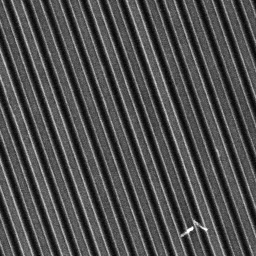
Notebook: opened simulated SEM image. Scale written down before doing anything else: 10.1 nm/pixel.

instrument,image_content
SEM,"parallel lines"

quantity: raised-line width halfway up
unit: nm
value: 98.9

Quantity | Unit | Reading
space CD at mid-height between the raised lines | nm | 78.5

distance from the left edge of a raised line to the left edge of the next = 182 nanometers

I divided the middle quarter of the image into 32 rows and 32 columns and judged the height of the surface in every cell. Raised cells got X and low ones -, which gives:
XX--XXX--XXX--XXX--XX---XX--XXX-
XXX--XX---XX--XXX--XXX--XXX--XX-
XXX--XXX--XX---XX--XXX--XXX--XXX
-XX--XXX--XXX--XXX--XX---XX--XXX
-XXX--XXX--XX--XXX--XXX--XXX--XX
-XXX--XXX--XXX--XX---XX--XXX--XX
--XX---XX--XXX--XXX--XX---XX--XX
--XXX--XXX--XX--XXX--XXX--XXX--X
--XXX--XXX--XXX--XX---XX--XXX--X
X--XX--XXX--XXX--XXX--XX---XX--X
X--XXX--XXX--XX--XXX--XXX--XXX--
X--XXX--XXX--XXX--XXX--XX---XX--
XX--XX--XXX--XXX--XXX--XXX--XX--
XX--XXX--XXX--XX---XX--XXX--XXX-
XX---XX--XXX--XXX--XXX--XX---XX-
XXX--XX---XX--XXX--XXX--XXX--XX-
-XX--XXX--XXX--XX--XXX--XXX--XXX
-XX---XX--XXX--XXX--XXX--XX---XX
-XXX--XX---XX--XXX--XXX--XXX--XX
-XXX--XXX--XXX--XX--XXX--XXX--XX
--XXX--XX--XXX--XXX--XXX--XX---X
--XXX--XX---XX--XXX--XXX--XXX--X
---XX--XXX--XXX--XX---XX--XXX--X
X--XXX--XX--XXX--XXX--XXX--XX---
X--XXX--XXX--XX---XX--XXX--XXX--
X---XX--XXX--XXX--XXX--XX--XXX--
XX--XXX--XX--XXX--XXX--XXX--XX--
XX--XXX--XXX--XX---XX--XXX--XXX-
XX---XX--XXX--XXX--XX---XX--XXX-
XXX--XXX--XX--XXX--XXX--XXX--XX-
XXX--XXX--XXX--XXX--XX--XXX--XXX
-XX---XX--XXX--XXX--XXX--XX---XX